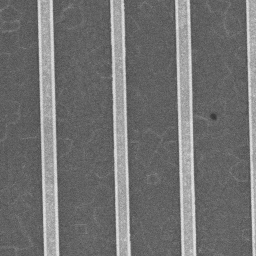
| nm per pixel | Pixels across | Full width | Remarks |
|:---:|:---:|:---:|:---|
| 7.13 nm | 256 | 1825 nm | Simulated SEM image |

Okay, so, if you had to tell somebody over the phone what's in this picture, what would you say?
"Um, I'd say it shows one or a few lines or trenches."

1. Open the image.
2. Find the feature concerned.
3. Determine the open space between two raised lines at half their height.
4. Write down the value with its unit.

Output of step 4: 417 nm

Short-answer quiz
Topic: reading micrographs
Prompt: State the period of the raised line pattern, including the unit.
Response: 490 nanometres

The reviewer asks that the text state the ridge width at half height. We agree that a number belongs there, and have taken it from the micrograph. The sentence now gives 85.5 nm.